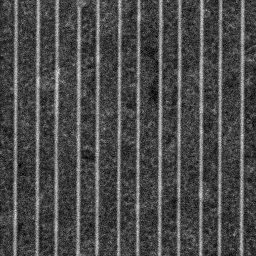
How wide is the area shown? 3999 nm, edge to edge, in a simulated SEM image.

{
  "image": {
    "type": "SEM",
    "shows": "parallel lines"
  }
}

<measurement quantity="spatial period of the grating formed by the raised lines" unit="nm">638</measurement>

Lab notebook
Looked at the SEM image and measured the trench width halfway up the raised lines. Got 22.3 pixels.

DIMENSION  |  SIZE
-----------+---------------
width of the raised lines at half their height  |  293 nm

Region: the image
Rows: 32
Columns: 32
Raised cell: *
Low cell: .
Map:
**...**...**...**...**...***..**
**...**...**...**...**...**...**
**...**...**...**...**...**...**
**...**...**...**...**...**...**
**...**...**...**...**...**...**
**...**...**...**...**...**...**
**...**...**...**...**...**...**
**...**...**...**...**...**...**
**...**...**...**...**...**...**
**...**...**...**...**...**...**
**...**...**...**...**...**...**
**...**...**...**...**...**...**
**...**...**...**...**...**...**
**...**...**...**...**...**...**
**...**...**...**...**...**...**
**...**...**...**...**...**...**
**...**...**...**...**...**...**
**...**...**...**...**...**...**
**...**...**...**...**...**...**
**...**...**...**...**...**...**
**...**...**...**...**...**...**
**...**...**...**...**...**...**
**...**...**...**...**...**...**
**...**...**...**...**...**...**
**...**...**...**...**...**...**
**...**...**...**...**...**...**
**...**...**...**...**...**...**
**...**...**...**...**...**...**
**...**...**...**...**...**...**
**...**...**...**...**...**...**
**...**...**...**...**...**...**
**...**...**...**...**...**...**